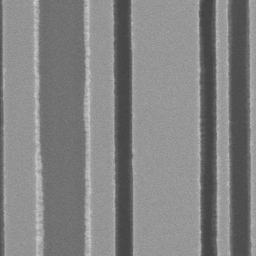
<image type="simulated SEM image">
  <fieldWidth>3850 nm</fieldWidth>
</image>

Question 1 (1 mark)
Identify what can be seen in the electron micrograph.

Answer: lines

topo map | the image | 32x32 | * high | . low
****.......***..*********..**..*
****.......***..*********..*...*
*****......***..*********..*...*
*****......***..*********..**..*
*****......***..*********..**..*
*****......***..*********..**..*
*****......***..*********..**..*
*****......***...********..**..*
*****......***...********..**..*
*****......***...********..**..*
*****......***...********..**..*
*****......***...********..**..*
*****......***...********..**..*
.****......***...********..**..*
.****......***...********..**..*
*****......***...********..**..*
*****......***...********..**..*
.****......***...********..**..*
.****......***...********..**..*
*****......***...********..**..*
.****......***...********..**..*
.****......***...********..**..*
.****......***...********..**..*
.****......***...********..**..*
.****......***...********..**..*
.****......***...********..**..*
.****......***...********..**..*
.****......***...********..**..*
.****......***...********..**..*
.****......***...********..**..*
.****......***...********..**..*
.****......***...********..**..*